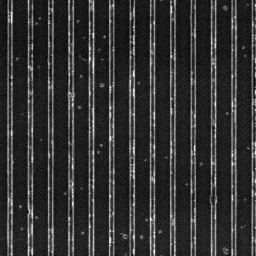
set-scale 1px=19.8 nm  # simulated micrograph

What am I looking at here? parallel lines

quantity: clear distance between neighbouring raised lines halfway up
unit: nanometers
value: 322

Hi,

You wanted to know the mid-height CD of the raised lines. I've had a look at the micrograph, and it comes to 84.3 nanometres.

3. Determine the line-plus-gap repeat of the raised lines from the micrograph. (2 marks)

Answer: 404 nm